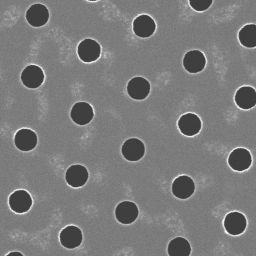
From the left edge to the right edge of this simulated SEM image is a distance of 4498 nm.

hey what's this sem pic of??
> a regular array of holes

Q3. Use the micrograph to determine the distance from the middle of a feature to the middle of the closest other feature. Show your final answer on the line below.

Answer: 1080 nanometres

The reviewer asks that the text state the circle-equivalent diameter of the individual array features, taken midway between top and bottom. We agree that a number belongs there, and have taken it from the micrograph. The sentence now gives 405 nanometers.